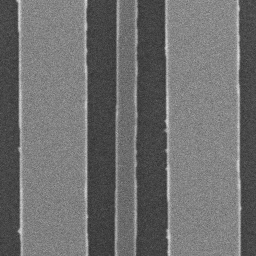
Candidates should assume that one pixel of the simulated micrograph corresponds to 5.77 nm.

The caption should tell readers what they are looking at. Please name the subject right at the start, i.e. lines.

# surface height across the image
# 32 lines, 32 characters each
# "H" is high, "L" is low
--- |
LLHHHHHHHHHLLLLHHLLLLHHHHHHHHHLL
LLHHHHHHHHHLLLLHHLLLLHHHHHHHHHLL
LLHHHHHHHHHLLLLHHLLLLHHHHHHHHHLL
LLHHHHHHHHHLLLLHHLLLLHHHHHHHHHLL
LLHHHHHHHHHLLLLHHLLLLHHHHHHHHHLL
LLHHHHHHHHHLLLLHHLLLLHHHHHHHHHLL
LLHHHHHHHHHLLLLHHLLLLHHHHHHHHHLL
LLHHHHHHHHHLLLLHHLLLLHHHHHHHHHLL
LLHHHHHHHHHLLLLHHLLLLHHHHHHHHHLL
LLHHHHHHHHHLLLLHHLLLLHHHHHHHHHLL
LLHHHHHHHHHLLLLHHLLLLHHHHHHHHHLL
LLHHHHHHHHHLLLLHHLLLLHHHHHHHHHLL
LLHHHHHHHHHLLLLHHLLLLHHHHHHHHHLL
LLHHHHHHHHHLLLLHHLLLLHHHHHHHHHLL
LLHHHHHHHHHLLLLHHLLLLHHHHHHHHHLL
LLHHHHHHHHHLLLLHHLLLLHHHHHHHHHLL
LLLHHHHHHHHLLLLHHLLLLHHHHHHHHHLL
LLLHHHHHHHHLLLLHHLLLLHHHHHHHHHLL
LLLHHHHHHHHLLLLHHLLLLHHHHHHHHHLL
LLLHHHHHHHHLLLLHHLLLLHHHHHHHHHLL
LLLHHHHHHHHLLLLHHLLLLHHHHHHHHHLL
LLLHHHHHHHHLLLLHHLLLLHHHHHHHHHLL
LLLHHHHHHHHLLLLHHLLLLHHHHHHHHHLL
LLLHHHHHHHHLLLLHHLLLLHHHHHHHHHLL
LLLHHHHHHHHLLLLHHLLLLHHHHHHHHHLL
LLLHHHHHHHHLLLHHHLLLLHHHHHHHHHLL
LLLHHHHHHHHLLLHHHLLLLHHHHHHHHHLL
LLLHHHHHHHHLLLHHHLLLLHHHHHHHHHLL
LLLHHHHHHHHLLLHHHLLLLHHHHHHHHHLL
LLLHHHHHHHHLLLHHHLLLLHHHHHHHHHLL
LLLHHHHHHHHLLLHHHLLLLHHHHHHHHHLL
LLLHHHHHHHHLLLHHHLLLLHHHHHHHHHLL